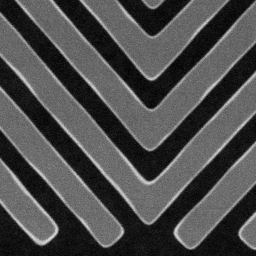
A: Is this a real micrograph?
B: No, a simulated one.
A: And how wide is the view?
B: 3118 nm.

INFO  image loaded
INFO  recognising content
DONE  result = groups of lines, slits or small figures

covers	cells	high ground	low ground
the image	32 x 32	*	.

..*****....****...**....****....
...*****...*****.......****....*
*...*****...*****.....****....**
**...****....*****...****....***
***...****....**********....****
***....****....*********...*****
****....****....*******...*****.
.****...*****...******...*****..
..****...*****...****...*****...
...****...*****...**...*****....
...*****...*****......*****....*
*...****....****.....*****....**
*....****....****...*****....***
**....****....****.*****....****
***....****....********....*****
****....****...*******....*****.
*****...*****...*****....*****..
.*****...*****...***....*****...
..*****...*****...*....*****...*
...****....****.......*****...**
*...****....****.....*****...***
*....****....****...*****...****
**....****....****.*****...*****
***....****....********....****.
****...*****...*******....****..
*****...*****...*****....****...
.*****...*****...***....*****...
..*****...*****...*....*****...*
...****....****.......*****...**
....***.....***.......****....**
.............*.........**......*
................................